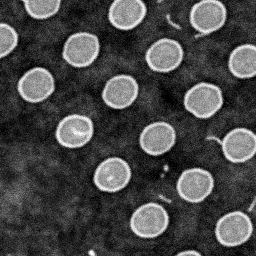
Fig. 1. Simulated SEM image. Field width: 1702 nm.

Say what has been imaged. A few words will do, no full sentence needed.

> a regular array of raised bodies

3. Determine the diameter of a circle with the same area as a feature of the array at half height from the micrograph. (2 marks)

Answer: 218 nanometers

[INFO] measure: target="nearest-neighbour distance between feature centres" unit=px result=57.6